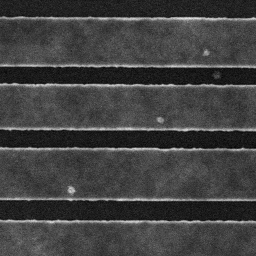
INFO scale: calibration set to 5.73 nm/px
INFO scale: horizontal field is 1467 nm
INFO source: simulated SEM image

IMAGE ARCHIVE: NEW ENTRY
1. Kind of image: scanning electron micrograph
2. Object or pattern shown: lines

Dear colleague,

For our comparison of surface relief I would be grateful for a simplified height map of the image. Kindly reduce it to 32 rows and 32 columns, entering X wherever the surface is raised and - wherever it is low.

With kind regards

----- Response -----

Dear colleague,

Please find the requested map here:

--------------------------------
--------------------------------
XXXXXXXXXXXXXXXXXXXXXXXXXXXXXXXX
XXXXXXXXXXXXXXXXXXXXXXXXXXXXXXXX
XXXXXXXXXXXXXXXXXXXXXXXXXXXXXXXX
XXXXXXXXXXXXXXXXXXXXXXXXXXXXXXXX
XXXXXXXXXXXXXXXXXXXXXXXXXXXXXXXX
XXXXXXXXXXXXXXXXXXXXXXXXXXXXXXXX
--------------------------------
--------------------------------
XXX---X-------------------------
XXXXXXXXXXXXXXXXXXXXXXXXXXXXXXXX
XXXXXXXXXXXXXXXXXXXXXXXXXXXXXXXX
XXXXXXXXXXXXXXXXXXXXXXXXXXXXXXXX
XXXXXXXXXXXXXXXXXXXXXXXXXXXXXXXX
XXXXXXXXXXXXXXXXXXXXXXXXXXXXXXXX
--------------------------------
--------------------------------
X--X-----X----------------------
XXXXXXXXXXXXXXXXXXXXXXXXXXXXXXXX
XXXXXXXXXXXXXXXXXXXXXXXXXXXXXXXX
XXXXXXXXXXXXXXXXXXXXXXXXXXXXXXXX
XXXXXXXXXXXXXXXXXXXXXXXXXXXXXXXX
XXXXXXXXXXXXXXXXXXXXXXXXXXXXXXXX
XXXXXXXXXXXXXXXXXXXXXXXXXXXXXXXX
--------------------------------
--------------------------------
--------------------------------
XXXXXXXXXXXXXXXXXXXXXXXXXXXXXXXX
XXXXXXXXXXXXXXXXXXXXXXXXXXXXXXXX
XXXXXXXXXXXXXXXXXXXXXXXXXXXXXXXX
XXXXXXXXXXXXXXXXXXXXXXXXXXXXXXXX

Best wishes